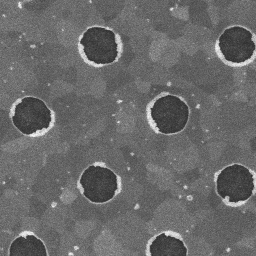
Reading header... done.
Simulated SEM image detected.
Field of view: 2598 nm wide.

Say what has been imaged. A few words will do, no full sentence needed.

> holes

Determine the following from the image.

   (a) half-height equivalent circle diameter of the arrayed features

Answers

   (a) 378 nanometres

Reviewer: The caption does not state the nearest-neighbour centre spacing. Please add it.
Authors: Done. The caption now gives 971 nanometers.